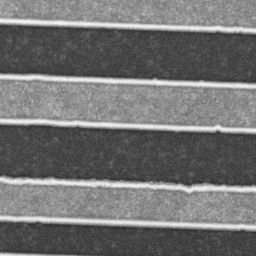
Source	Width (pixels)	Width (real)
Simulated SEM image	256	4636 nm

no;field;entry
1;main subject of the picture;one or a few lines or trenches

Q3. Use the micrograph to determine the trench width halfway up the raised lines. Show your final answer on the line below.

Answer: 1030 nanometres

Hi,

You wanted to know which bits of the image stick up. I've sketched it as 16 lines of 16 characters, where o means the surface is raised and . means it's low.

oooooooooooooooo
.....ooooooooooo
................
................
................
oooooooooooooooo
oooooooooooooooo
oooooooooooooooo
................
................
................
ooooooo.........
oooooooooooooooo
oooooooooooooooo
................
................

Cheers